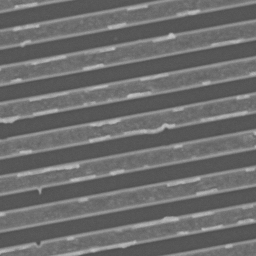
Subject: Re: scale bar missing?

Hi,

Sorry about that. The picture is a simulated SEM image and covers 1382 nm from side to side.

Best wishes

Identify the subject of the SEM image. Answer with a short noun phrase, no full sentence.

parallel lines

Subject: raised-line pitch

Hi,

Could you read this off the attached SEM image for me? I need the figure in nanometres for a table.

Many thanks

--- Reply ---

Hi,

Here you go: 194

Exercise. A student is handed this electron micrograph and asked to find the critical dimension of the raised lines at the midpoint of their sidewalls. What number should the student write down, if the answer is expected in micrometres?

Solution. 0.102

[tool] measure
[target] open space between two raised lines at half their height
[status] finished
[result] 91.7 nm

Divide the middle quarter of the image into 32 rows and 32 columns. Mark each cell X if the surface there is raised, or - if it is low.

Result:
XXXXXXXXXXX---------------------
XXXXXX------------------------XX
-------------------------XXXXXXX
-------------------XXXXXXXXXXXXX
--------------XXXXXXXXXXXXXXXXXX
--------XXXXXXXXXXXXXXXXXXXXXXXX
---XXXXXXXXXXXXXXXXXXXXXXXXX----
XXXXXXXXXXXXXXXXXXXXXXX---------
XXXXXXXXXXXXXXXXX---------------
XXXXXXXXXXXX--------------------
XXXXXX-------------------------X
X------------------------XXXXXXX
--------------------XXXXXXXXXXXX
--------------XXXXXXXXXXXXXXXXXX
--------XXXXXXXXXXXXXXXXXXXXXXXX
---XXXXXXXXXXXXXXXXXXXXXXXXXX---
XXXXXXXXXXXXXXXXXXXXXXXX--------
XXXXXXXXXXXXXXXXXX--------------
XXXXXXXXXXXX--------------------
XXXXXXX------------------------X
X--------------------------XXXXX
---------------------XXXXXXXXXXX
----------------XXXXXXXXXXXXXXXX
----------XXXXXXXXXXXXXXXXXXXXXX
-----XXXXXXXXXXXXXXXXXXXXXXXX---
XXXXXXXXXXXXXXXXXXXXXXXX--------
XXXXXXXXXXXXXXXXXX--------------
XXXXXXXXXXXXX-------------------
XXXXXXX-------------------------
XX------------------------XXXXXX
--------------------XXXXXXXXXXXX
---------------XXXXXXXXXXXXXXXXX